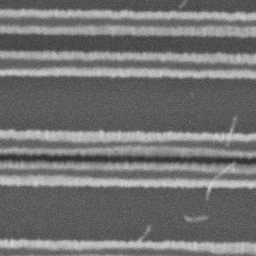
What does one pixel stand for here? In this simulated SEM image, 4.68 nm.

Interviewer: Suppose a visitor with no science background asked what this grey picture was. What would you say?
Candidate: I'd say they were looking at lines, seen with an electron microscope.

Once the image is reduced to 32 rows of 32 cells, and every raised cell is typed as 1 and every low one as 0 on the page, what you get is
00000000000000000000000000000000
00010000000000000000000000000000
11111111111111111111111111111111
11111111111111111111111111111111
00000000000000000000000000000000
00000000000000000000000000000000
00000000000000000000000000000000
11111111111111111111111111111111
11111111111111111111111111111111
00000000000000000000000000000000
00000000000000000000000000000000
00000000000000000000000000000000
00000000000000000000000000000000
00000000000000000000000000000000
00000000000000000000000000000000
00000000000000000000000000000000
00000000000000000000000000000000
11111111111111111111111111111111
11111111111111111111111111111111
00000000000000000000000000000011
11101110100000000000000000000000
11111111111111111111111111111111
11111111111111111111111111111111
00000000000000000000000000000000
00000000000000000000000000000000
00000000000000000000000000000000
00000000000000000000000000000000
00000000000000000000000000000000
00000000000000000000000000000000
00000000000000000000000000000000
11111100000001101000010000000000
11111111111111111111111111111111